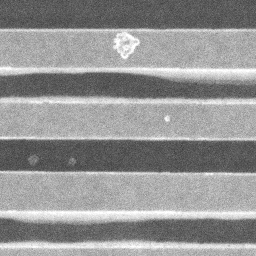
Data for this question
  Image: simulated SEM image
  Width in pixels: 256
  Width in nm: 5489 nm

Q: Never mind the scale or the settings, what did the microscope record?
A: lines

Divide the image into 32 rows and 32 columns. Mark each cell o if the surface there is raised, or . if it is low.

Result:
................................
................................
................................
................................
oooooooooooooooooooooooooooooooo
oooooooooooooooooooooooooooooooo
oooooooooooooooooooooooooooooooo
oooooooooooooooooooooooooooooooo
oooooooooooooooooooooooooooooooo
................................
................................
................................
................................
oooooooooooooooooooooooooooooooo
oooooooooooooooooooooooooooooooo
oooooooooooooooooooooooooooooooo
oooooooooooooooooooooooooooooooo
................................
................................
................................
................................
ooo.............................
oooooooooooooooooooooooooooooooo
oooooooooooooooooooooooooooooooo
oooooooooooooooooooooooooooooooo
oooooooooooooooooooooooooooooooo
oooooooooooooooooooooooooooooooo
................................
................................
................................
................................
oooooooooooooooooooooooooooooooo